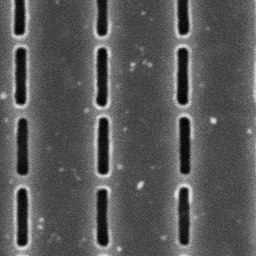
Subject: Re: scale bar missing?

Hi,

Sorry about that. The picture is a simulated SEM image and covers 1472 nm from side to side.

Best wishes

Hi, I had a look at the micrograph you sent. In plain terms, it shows a regular array of holes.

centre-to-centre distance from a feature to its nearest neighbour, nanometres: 403